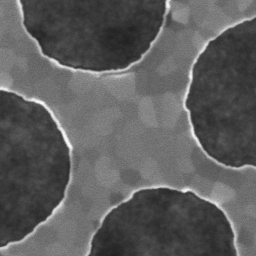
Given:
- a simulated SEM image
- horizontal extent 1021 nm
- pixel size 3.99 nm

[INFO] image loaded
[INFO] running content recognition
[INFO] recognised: holes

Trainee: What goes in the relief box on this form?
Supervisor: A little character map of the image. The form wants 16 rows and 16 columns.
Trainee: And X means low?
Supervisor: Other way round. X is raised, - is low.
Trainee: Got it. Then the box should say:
X---------XXXXXX
XX--------XXXXX-
XX--------XXX---
XXX------XXX----
XXXXXXXXXXXX----
XXXXXXXXXXXX----
--XXXXXXXXXX----
---XXXXXXXXX----
----XXXXXXXX----
----XXXXXXXXX---
----XXXXXXXXXXXX
----XXXXXXXXXXXX
----XXXX-----XXX
---XXXX-------XX
--XXXX---------X
XXXXXX---------X